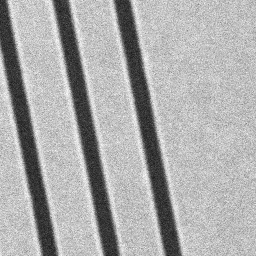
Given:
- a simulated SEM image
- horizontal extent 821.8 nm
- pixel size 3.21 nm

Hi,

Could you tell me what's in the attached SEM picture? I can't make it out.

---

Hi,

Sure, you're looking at parallel lines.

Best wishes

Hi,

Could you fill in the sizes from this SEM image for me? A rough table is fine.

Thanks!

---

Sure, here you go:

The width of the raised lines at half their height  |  0.132 micrometres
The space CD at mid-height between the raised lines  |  61.4 nm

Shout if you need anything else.